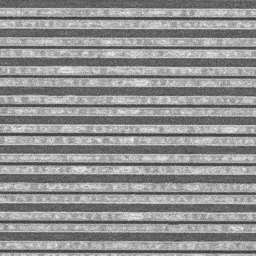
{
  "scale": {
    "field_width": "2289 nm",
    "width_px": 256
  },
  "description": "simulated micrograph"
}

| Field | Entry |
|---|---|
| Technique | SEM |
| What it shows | parallel lines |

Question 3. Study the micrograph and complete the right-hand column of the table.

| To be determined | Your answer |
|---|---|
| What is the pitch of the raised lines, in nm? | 130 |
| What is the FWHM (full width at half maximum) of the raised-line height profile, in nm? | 69.3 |